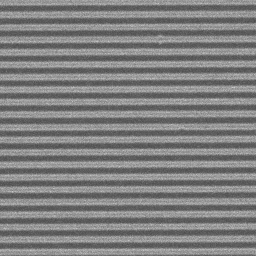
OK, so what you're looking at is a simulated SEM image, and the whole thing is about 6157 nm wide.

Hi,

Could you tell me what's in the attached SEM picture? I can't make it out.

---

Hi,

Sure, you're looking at parallel lines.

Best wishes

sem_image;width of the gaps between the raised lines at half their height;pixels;7.75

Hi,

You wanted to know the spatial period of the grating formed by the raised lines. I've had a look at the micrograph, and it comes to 0.3 microns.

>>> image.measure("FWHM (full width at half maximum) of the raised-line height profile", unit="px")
5.19